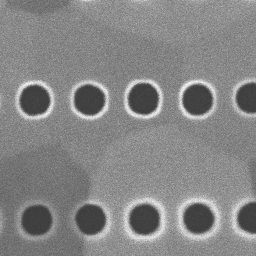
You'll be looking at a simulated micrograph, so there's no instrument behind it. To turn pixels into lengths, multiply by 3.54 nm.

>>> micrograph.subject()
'a regular array of holes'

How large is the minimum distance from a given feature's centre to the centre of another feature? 0.191 micrometres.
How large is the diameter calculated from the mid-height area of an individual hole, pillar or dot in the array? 30.8 px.